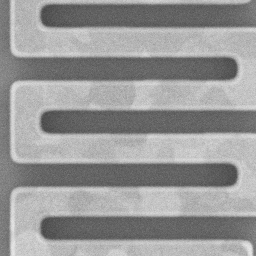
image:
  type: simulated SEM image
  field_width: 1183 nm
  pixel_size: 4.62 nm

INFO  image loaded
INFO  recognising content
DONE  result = groups of lines, slits or small figures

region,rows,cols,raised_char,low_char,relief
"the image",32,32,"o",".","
..oooo..........................
..ooo...........................
..ooo...........................
..oooo..........................
..oooooooooooooooooooooooooooooo
..oooooooooooooooooooooooooooooo
..oooooooooooooooooooooooooooooo
..............................oo
..............................oo
..............................oo
..oooooooooooooooooooooooooooooo
..oooooooooooooooooooooooooooooo
..oooooooooooooooooooooooooooooo
..ooooo.........................
..ooo...........................
..ooo...........................
..ooo...........................
..oooooooooooooooooooooooooooooo
..oooooooooooooooooooooooooooooo
..oooooooooooooooooooooooooooooo
.............................ooo
..............................oo
..............................oo
.............................ooo
..oooooooooooooooooooooooooooooo
..oooooooooooooooooooooooooooooo
..oooooooooooooooooooooooooooooo
..ooo...........................
..ooo...........................
..ooo...........................
..ooooooooooooooooooooooooooooo.
..ooooooooooooooooooooooooooooo.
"